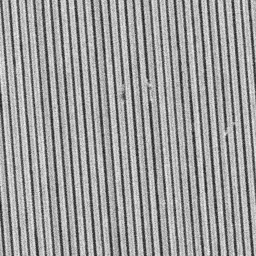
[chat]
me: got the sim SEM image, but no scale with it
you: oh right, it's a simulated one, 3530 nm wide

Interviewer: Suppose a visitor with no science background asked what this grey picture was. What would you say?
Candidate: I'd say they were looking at parallel lines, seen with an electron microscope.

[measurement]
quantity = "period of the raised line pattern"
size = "8.24 pixels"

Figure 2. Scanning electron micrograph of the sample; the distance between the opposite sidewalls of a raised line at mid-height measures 55 nanometres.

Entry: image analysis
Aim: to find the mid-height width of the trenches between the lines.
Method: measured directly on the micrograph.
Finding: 0.0532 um